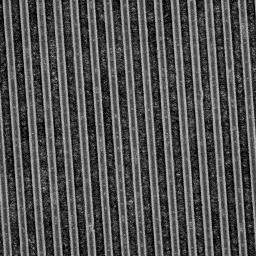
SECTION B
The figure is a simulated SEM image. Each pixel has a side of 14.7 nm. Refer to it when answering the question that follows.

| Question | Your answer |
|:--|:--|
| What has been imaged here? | parallel lines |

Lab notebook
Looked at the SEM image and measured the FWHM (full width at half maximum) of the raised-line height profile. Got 103 nm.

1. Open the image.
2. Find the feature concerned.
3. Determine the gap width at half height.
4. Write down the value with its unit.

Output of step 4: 0.154 µm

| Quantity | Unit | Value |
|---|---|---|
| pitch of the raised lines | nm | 247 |